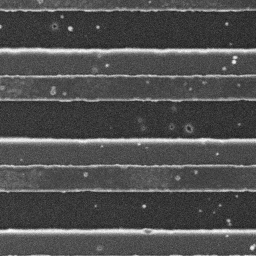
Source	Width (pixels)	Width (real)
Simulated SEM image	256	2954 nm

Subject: lines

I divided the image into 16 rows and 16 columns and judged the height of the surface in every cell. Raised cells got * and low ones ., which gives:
****************
................
................
****************
****************
****************
................
................
................
****************
****************
****************
................
................
****************
****************